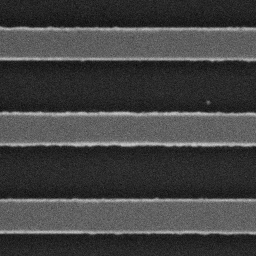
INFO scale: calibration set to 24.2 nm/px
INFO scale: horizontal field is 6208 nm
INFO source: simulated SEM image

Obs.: lines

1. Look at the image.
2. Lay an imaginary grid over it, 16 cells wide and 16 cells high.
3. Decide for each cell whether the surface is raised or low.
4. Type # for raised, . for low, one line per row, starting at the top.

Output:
................
................
################
################
................
................
................
################
################
................
................
................
################
################
################
................